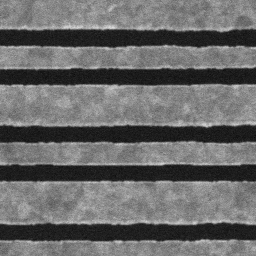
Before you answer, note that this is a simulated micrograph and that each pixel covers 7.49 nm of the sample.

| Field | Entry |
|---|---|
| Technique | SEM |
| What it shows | lines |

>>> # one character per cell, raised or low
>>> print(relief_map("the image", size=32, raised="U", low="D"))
UUUUUUUUUUUUUUUUUUUUUUUUUUUUUUUU
UUUUUUUUUUUUUUUUUUUUUUUUUUUUUUUU
UUUUUUUUUUUUUUUUUUUUUUUUUUUUUUUU
DDDDUUDDDDDDDDDDDUUUDUUUUUUUUDDD
DDDDDDDDDDDDDDDDDDDDDDDDDDDDDDDD
DDDDDDDDDDDDDDDDDDDDDDDDDDDDDDDD
UUUUUUUUUUUUUUUUUUUUUUUUUUUUUUUU
UUUUUUUUUUUUUUUUUUUUUUUUUUUUUUUU
UUUUUUUUUDDDDDDDUUUUDDDDDUDUDDDD
DDDDDDDDDDDDDDDDDDDDDDDDDDDDDDDD
DDDDDDDDDDDDDDDDDDDDDDDDDDDDDDDD
UUUUUUUUUUUUUUUUUUUUUUUUUUUUUUUU
UUUUUUUUUUUUUUUUUUUUUUUUUUUUUUUU
UUUUUUUUUUUUUUUUUUUUUUUUUUUUUUUU
UUUUUUUUUUUUUUUUUUUUUUUUUUUUUUUU
DUUDDUDUUDDDDDDDDDDDDUUDDUUDDDDD
DDDDDDDDDDDDDDDDDDDDDDDDDDDDDDDD
DDDDDDDDDDDDDDDDDDDDDDDDDDDDDDDD
UUUUUUUUUUUUUUUUUUUUUUUUUUUUUUUU
UUUUUUUUUUUUUUUUUUUUUUUUUUUUUUUU
DDDDDDDUDUUUUUUUUUUUUDDDDUUUUUDD
DDDDDDDDDDDDDDDDDDDDDDDDDDDDDDDD
DDDDDDDDDDDDDDDDDDDDDDDDDDDDDDDD
UUUUUUUUUUUUUUUUUUUUUUUUUUUUUUUU
UUUUUUUUUUUUUUUUUUUUUUUUUUUUUUUU
UUUUUUUUUUUUUUUUUUUUUUUUUUUUUUUU
UUUUUUUUUUUUUUUUUUUUUUUUUUUUUUUU
UUUUUUUUUUUUUUUUUUUUUUUUUUUUUUUU
DDDDDDDDDDDDDDDDDDDDDDDDDDDDDDDD
DDDDDDDDDDDDDDDDDDDDDDDDDDDDDDDD
UUUUUUUUUUUUUUUUUUUUUUUUUUUUUUUU
UUUUUUUUUUUUUUUUUUUUUUUUUUUUUUUU